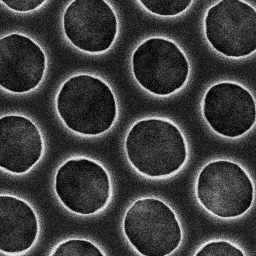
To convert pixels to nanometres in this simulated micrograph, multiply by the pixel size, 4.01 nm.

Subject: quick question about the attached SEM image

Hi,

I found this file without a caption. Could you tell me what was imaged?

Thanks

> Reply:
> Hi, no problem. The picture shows holes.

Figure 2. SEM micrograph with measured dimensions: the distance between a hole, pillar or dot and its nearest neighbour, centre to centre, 324 nanometers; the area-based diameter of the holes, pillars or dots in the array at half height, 0.226 µm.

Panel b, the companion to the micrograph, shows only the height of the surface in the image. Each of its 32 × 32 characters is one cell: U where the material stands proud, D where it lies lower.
UDDDDUUUUDDDDUUUUUDDDDDDUUUDDDDU
UUUUUUUUDDDDDDUUUUUDDDDUUUDDDDDD
UUUUUUUUDDDDDDDUUUUUUUUUUUDDDDDD
UUUUUUUUDDDDDDDUUUUUUUUUUUDDDDDD
UDDUUUUUDDDDDDUUUUUUUUUUUUDDDDDD
DDDDUUUUUDDDDDUUUUDDDDUUUUDDDDDD
DDDDDUUUUUUUUUUUUDDDDDDUUUUUDDDD
DDDDDDUUUUUUUUUUUDDDDDDUUUUUUUUU
DDDDDDUUUUUUUUUUUDDDDDDDUUUUUUUU
DDDDDUUUUUDUUUUUUDDDDDDUUUUUUUUU
DDDDDUUUDDDDDUUUUUDDDDDUUUUDDUUU
UUDUUUUDDDDDDDUUUUUDDDUUUUDDDDDU
UUUUUUUDDDDDDDUUUUUUUUUUUUDDDDDD
UUUUUUUDDDDDDDDUUUUUUUUUUDDDDDDD
UDDUUUUUDDDDDDUUUUUUUUUUUUDDDDDD
DDDDUUUUDDDDDDUUUDDDDUUUUUDDDDDD
DDDDDUUUUUDDDUUUDDDDDDUUUUUDDDDU
DDDDDUUUUUUUUUUUDDDDDDDUUUUUUUUU
DDDDDUUUUUUUUUUUDDDDDDDUUUUUUUUU
DDDDDUUUUUUUUUUUDDDDDDDUUUUUUUUU
DDDDUUUUDDDDUUUUUDDDDDDUUUDDDUUU
UUDUUUUDDDDDDUUUUUDDDDUUUDDDDDDU
UUUUUUUDDDDDDDUUUUUUUUUUUDDDDDDU
UUUUUUUDDDDDDDUUUUUUUUUUUDDDDDDD
DUUUUUUDDDDDDDUUUUUUUUUUUDDDDDDD
DDDUUUUUDDDDDUUUUDDDDUUUUDDDDDDU
DDDDUUUUUDDDUUUUDDDDDDUUUUDDDDDU
DDDDDUUUUUUUUUUUDDDDDDUUUUUUUUUU
DDDDDUUUUUUUUUUUDDDDDDUUUUUUUUUU
DDDDDUUUUUUUUUUUDDDDDDDUUUUUUUUU
DDDDUUUUDDDDUUUUDDDDDDUUUUDDDUUU
UDDUUUUDDDDDDUUUUDDDDUUUUDDDDDUU